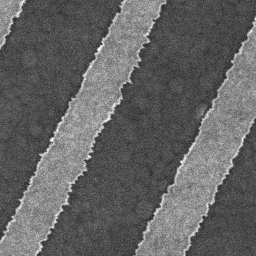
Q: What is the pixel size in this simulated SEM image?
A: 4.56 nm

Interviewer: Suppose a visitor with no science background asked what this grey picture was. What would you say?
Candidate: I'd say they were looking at one or a few lines or trenches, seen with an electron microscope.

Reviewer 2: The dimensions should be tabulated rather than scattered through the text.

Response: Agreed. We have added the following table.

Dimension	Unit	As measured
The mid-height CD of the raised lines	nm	189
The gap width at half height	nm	394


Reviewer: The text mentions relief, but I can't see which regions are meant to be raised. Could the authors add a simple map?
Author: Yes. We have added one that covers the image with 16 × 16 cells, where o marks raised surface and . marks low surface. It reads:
o.......oo......
o......ooo......
......ooo......o
......ooo......o
.....ooo......oo
.....ooo......oo
....ooo......ooo
....ooo......ooo
...ooo......ooo.
...ooo......ooo.
..ooo......ooo..
..ooo......ooo..
.ooo......ooo...
.ooo.....oooo...
ooo......ooo....
oo.......ooo....